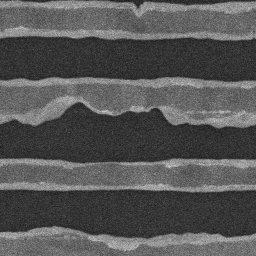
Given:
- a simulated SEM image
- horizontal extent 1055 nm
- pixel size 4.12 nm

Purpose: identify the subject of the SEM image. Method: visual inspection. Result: one or a few lines or trenches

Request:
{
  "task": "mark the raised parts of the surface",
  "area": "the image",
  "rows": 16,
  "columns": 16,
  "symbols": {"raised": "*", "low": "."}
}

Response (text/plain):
****************
****************
................
................
................
****************
****.***********
...........*****
................
................
****************
****************
................
................
..***...........
****************